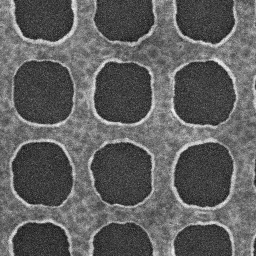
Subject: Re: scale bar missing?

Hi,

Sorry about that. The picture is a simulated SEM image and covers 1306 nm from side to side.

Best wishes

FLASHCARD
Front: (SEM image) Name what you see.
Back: holes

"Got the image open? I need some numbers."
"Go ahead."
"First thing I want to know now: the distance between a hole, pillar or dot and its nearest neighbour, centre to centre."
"409 nm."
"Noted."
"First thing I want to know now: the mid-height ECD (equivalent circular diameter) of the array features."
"332 nm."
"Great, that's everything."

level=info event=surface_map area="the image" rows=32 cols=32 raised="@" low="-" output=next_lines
-@-------@@@-------@@@-------@@@
@@-------@@@-------@@@-------@@@
@@-------@@--------@@@-------@@@
@@-------@@@-------@@@-------@@@
@@@-----@@@@@-----@@@@@-----@@@@
@@@@@@@@@-@@@@@@@@@@@@-@@@@@@@@@
@@@-@@@@@@@@@@@@@@@@@@@@@@@@@@@@
@@@--@@@@@@-@@@@@@@@@@@@@@@@@@@@
@@------@@@@@-----@@@@@-----@@@@
@@-------@@@-------@@@-------@@@
@@-------@@@-------@@@-------@@@
@@-------@@@-------@@@--------@@
@@-------@@@-------@@@--------@@
@@-------@@@-------@@@-------@@@
@@@------@@@------@@@@-------@@@
@@@@@--@@@@@@@@@@@@@@@@@---@@@@@
@@@@@@@@@@@@@@@@@@@@@@@@@@@@@@@@
@@@@@@@@@-@@@@@@@@@@@@@@@@@@@@@@
@@@-----@@@@@-----@@@@@-----@@@@
@@------@@@@-------@@@-------@@@
@--------@@--------@@@-------@@@
@--------@@--------@@@-------@@-
@@-------@@@-------@@@-------@@@
@@-------@@@-------@@@-------@@@
@@-------@@@-------@@@-------@@@
@@@@----@@@@@-----@@@@@----@@@@@
@@@@@@@@--@@@-@@@@@@@@@@@@@@@@@@
@@@@@@@@@@@@@@@@@@@@@--@@@@@@-@@
@@------@@@@@-----@@@@@-----@@@@
@@------@@@@-------@@@-------@@@
@@-------@@@-------@@@-------@@@
@@-------@@@-------@@@-------@@@